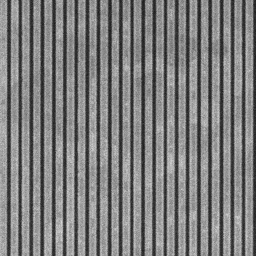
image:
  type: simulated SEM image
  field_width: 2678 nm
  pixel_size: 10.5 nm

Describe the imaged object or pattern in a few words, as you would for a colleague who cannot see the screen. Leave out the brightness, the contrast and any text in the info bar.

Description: parallel lines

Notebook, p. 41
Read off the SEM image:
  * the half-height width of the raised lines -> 0.0615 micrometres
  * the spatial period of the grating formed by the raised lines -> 117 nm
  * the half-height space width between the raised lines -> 51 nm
